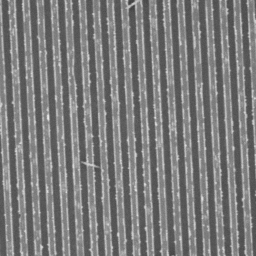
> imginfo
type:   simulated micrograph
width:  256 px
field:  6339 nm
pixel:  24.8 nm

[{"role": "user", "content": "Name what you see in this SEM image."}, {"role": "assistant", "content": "parallel lines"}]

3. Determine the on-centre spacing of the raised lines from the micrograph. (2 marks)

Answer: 348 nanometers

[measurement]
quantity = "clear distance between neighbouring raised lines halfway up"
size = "176 nm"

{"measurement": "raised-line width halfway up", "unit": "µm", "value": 0.173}